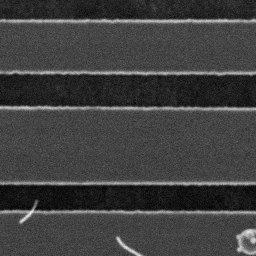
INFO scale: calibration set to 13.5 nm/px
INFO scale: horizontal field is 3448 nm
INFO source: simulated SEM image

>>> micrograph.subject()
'lines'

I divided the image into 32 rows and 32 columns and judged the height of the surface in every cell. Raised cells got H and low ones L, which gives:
LLLLLLLLLLLLLLLLLLLLLLLLLLLLLLLL
LLLLLLLLLLLLLLLLLLLLLLLLLLLLLLLL
HLLLLLLLLLLLLLLLLLLLLLLHLLLHLLLL
HHHHHHHHHHHHHHHHHHHHHHHHHHHHHHHH
HHHHHHHHHHHHHHHHHHHHHHHHHHHHHHHH
HHHHHHHHHHHHHHHHHHHHHHHHHHHHHHHH
HHHHHHHHHHHHHHHHHHHHHHHHHHHHHHHH
HHHHHHHHHHHHHHHHHHHHHHHHHHHHHHHH
HHHHHHHHHHHHHHHHHHHHHHHHHHHHHHHH
LLLLLLLLLLLLLLLLLLLLLLLLLLLLLLLL
LLLLLLLLLLLLLLLLLLLLLLLLLLLLLLLL
LLLLLLLLLLLLLLLLLLLLLLLLLLLLLLLL
LLLLLLLLLLLLLLLLLLLLLLLLLLLLLLLL
HHHHHHHHHHHHHHHHHLLHHHHLHLLLLLLL
HHHHHHHHHHHHHHHHHHHHHHHHHHHHHHHH
HHHHHHHHHHHHHHHHHHHHHHHHHHHHHHHH
HHHHHHHHHHHHHHHHHHHHHHHHHHHHHHHH
HHHHHHHHHHHHHHHHHHHHHHHHHHHHHHHH
HHHHHHHHHHHHHHHHHHHHHHHHHHHHHHHH
HHHHHHHHHHHHHHHHHHHHHHHHHHHHHHHH
HHHHHHHHHHHHHHHHHHHHHHHHHHHHHHHH
HHHHHHHHHHHHHHHHHHHHHHHHHHHHHHHH
HHHHHHHHHHHHHHHHHHHHHHHHHHHHHHHH
LLLLLLLLLLLLLLLLLLLLLLLLLLLLLLLL
LLLLLLLLLLLLLLLLLLLLLLLLLLLLLLLL
LLLLLLLLLLLLLLLLLLLLLLLLLLLLLLLL
HHHHHHHHHHHHHHHHHHHHHHHHHHHHHHHH
HHHHHHHHHHHHHHHHHHHHHHHHHHHHHHHH
HHHHHHHHHHHHHHHHHHHHHHHHHHHHHHHH
HHHHHHHHHHHHHHHHHHHHHHHHHHHHHHHH
HHHHHHHHHHHHHHHHHHHHHHHHHHHHHHHH
HHHHHHHHHHHHHHHHHHHHHHHHHHHHHHHH